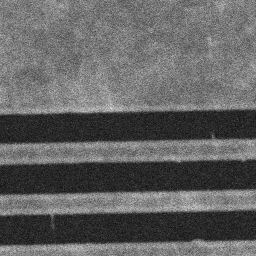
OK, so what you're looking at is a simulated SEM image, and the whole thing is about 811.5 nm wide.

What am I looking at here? parallel lines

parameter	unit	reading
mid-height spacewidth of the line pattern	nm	109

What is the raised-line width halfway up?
51.9 nm